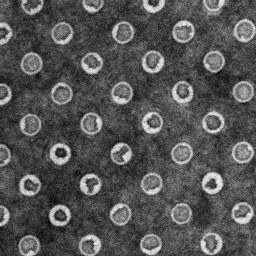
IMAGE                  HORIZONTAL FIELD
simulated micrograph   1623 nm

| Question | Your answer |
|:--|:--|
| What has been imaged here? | a regular array of raised bodies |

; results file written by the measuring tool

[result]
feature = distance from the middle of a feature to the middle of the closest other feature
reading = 0.268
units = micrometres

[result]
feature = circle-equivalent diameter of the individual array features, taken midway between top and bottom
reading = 128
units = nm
